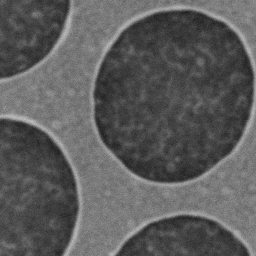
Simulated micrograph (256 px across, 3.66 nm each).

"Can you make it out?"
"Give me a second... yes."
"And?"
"holes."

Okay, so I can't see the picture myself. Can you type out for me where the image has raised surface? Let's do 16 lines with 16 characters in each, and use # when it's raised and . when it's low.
....############
....####......##
....###........#
...####.........
.#####..........
######..........
######..........
.#####..........
...###.........#
....###.......##
....####.....###
.....###########
.....###########
.....######.####
.....###......##
....####.......#